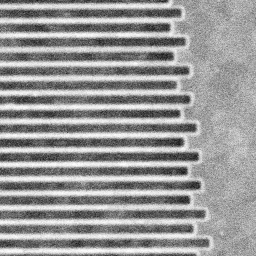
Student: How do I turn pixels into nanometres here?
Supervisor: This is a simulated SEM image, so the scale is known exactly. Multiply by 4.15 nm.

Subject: parallel lines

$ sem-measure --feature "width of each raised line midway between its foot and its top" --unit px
4.12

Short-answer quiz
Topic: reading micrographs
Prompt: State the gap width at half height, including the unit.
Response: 0.042 microns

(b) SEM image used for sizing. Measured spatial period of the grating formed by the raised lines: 59.7 nm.